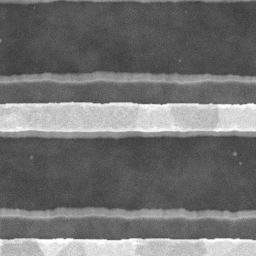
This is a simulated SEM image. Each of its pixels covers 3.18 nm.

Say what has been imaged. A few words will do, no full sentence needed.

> lines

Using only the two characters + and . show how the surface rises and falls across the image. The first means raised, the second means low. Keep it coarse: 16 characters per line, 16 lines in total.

................
................
................
................
................
++++++++++++++++
++++++++++++++++
++++++++++++++++
................
................
................
................
................
++++++++++++++.+
++++++++++++++++
++++++++++++++++